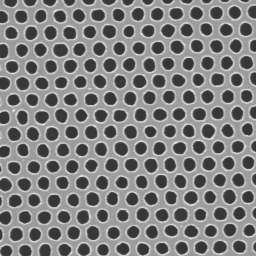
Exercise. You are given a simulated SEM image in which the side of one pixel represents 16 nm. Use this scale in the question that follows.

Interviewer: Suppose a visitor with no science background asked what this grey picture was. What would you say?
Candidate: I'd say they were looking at a regular array of holes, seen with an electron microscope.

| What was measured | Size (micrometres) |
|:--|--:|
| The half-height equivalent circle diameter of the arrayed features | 0.2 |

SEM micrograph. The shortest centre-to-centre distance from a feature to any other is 18.7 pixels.